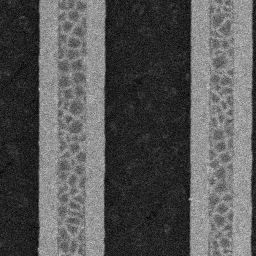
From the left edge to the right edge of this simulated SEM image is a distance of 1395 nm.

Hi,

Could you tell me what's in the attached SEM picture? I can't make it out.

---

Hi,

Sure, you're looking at one or a few lines or trenches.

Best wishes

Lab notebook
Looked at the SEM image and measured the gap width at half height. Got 567 nanometers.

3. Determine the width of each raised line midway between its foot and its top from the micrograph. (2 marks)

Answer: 0.247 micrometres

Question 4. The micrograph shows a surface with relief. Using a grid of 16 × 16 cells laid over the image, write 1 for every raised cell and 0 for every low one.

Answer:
0001110000000110
0001110000000110
0001110000000110
0001110000000110
0001110000000110
0001110000000110
0001110000000110
0001110000000110
0001110000001110
0001110000001110
0001110000001110
0001110000001110
0001110000001110
0001110000001110
0001110000001110
0001110000001110